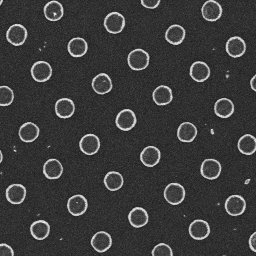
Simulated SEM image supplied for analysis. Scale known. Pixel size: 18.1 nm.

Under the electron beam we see a regular array of raised bodies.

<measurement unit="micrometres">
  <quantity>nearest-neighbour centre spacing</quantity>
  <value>0.786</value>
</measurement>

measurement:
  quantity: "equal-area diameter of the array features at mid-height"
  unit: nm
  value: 349